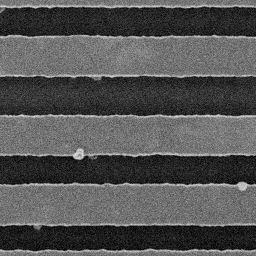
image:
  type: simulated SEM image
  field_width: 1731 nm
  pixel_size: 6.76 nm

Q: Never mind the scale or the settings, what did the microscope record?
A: lines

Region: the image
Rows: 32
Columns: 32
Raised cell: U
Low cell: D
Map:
UUUUUUUUUUUUUUUUUUUUUUUUUUUUUUUU
DDDDDDDDDDDDDDDDDDDDDDDDDDDDDDDD
DDDDDDDDDDDDDDDDDDDDDDDDDDDDDDDD
DDDDDDDDDDDDDDDDDDDDDDDDDDDDDDDD
DUUDDDDDDUUDDDDDDDDDDUDDDDUDDDDD
UUUUUUUUUUUUUUUUUUUUUUUUUUUUUUUU
UUUUUUUUUUUUUUUUUUUUUUUUUUUUUUUU
UUUUUUUUUUUUUUUUUUUUUUUUUUUUUUUU
UUUUUUUUUUUUUUUUUUUUUUUUUUUUUUUU
UUUUUUUUUUUUUUUUUUUUUUUUUUUUUUUU
DDDDDDDDDDDDDDDDDDDDDDDDDDDDDDDD
DDDDDDDDDDDDDDDDDDDDDDDDDDDDDDDD
DDDDDDDDDDDDDDDDDDDDDDDDDDDDDDDD
DDDDDDDDDDDDDDDDDDDDDDDDDDDDDDDD
UUUUUUUUUUUUDUUUUUUUUUUUUUUUUDUU
UUUUUUUUUUUUUUUUUUUUUUUUUUUUUUUU
UUUUUUUUUUUUUUUUUUUUUUUUUUUUUUUU
UUUUUUUUUUUUUUUUUUUUUUUUUUUUUUUU
UUUUUUUUUUUUUUUUUUUUUUUUUUUUUUUU
DDDDDDDDDUUDDDDDUDDDDDDDDDDDDDDD
DDDDDDDDDDDDDDDDDDDDDDDDDDDDDDDD
DDDDDDDDDDDDDDDDDDDDDDDDDDDDDDDD
DDDDDDDDDDDDDDDDDDDDDDDDDDDDDDDD
UUUUUUUUUUUUUUUUUUUUUUUUUUUUUUUU
UUUUUUUUUUUUUUUUUUUUUUUUUUUUUUUU
UUUUUUUUUUUUUUUUUUUUUUUUUUUUUUUU
UUUUUUUUUUUUUUUUUUUUUUUUUUUUUUUU
UUUUUUUUUUUUUUUUUUUUUUUUUUUUUUUU
DDDDDDDDDDDDDDDDDDDDDDDDDDDDDDDD
DDDDDDDDDDDDDDDDDDDDDDDDDDDDDDDD
DDDDDDDDDDDDDDDDDDDDDDDDDDDDDDDD
UUUUUUUUUUUUUUUUUUUUUUUUUUUUUUUU